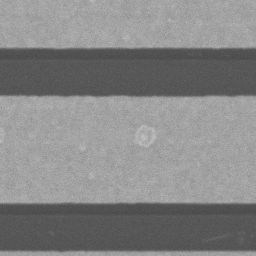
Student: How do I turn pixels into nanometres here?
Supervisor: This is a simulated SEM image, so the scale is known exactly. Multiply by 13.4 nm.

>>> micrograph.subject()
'lines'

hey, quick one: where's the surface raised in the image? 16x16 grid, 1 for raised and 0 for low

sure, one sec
1111111111111111
1111111111111111
1111111111111111
0000000000000000
0000000000000000
0000000000000000
1111111111111111
1111111111111111
1111111111111111
1111111111111111
1111111111111111
1111111111111111
1111111111111111
0000000000000000
0000000000000000
0000000000000000